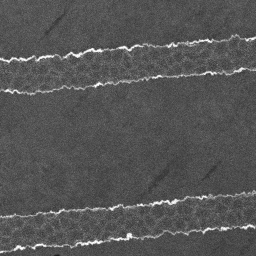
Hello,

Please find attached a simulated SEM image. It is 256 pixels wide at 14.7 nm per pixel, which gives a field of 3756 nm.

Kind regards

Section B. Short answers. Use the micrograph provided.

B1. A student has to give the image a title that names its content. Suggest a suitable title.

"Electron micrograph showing one or a few lines or trenches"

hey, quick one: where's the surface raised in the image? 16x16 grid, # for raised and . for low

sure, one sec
................
................
..............##
...#############
###############.
####............
................
................
................
................
................
................
...........#####
.###############
############....
#...............